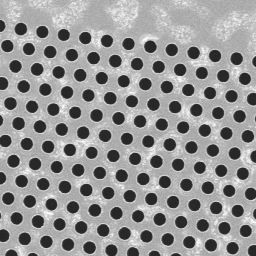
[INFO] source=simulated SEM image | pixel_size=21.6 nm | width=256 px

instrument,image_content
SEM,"a regular array of holes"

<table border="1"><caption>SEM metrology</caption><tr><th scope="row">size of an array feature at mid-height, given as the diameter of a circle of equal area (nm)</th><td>272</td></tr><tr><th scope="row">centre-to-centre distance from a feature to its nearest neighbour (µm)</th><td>0.465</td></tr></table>